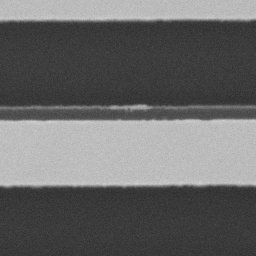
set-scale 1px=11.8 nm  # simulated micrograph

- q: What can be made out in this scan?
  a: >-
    lines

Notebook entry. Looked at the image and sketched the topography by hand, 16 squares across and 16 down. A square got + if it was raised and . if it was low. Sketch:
++++++++++++++++
................
................
................
................
................
................
................
++++++++++++++++
++++++++++++++++
++++++++++++++++
++++++++++++++++
................
................
................
................